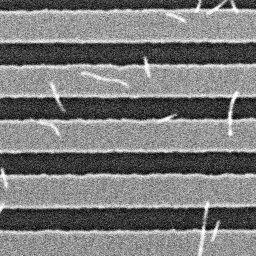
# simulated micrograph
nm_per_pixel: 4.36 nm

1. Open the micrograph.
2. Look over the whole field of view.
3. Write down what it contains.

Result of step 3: lines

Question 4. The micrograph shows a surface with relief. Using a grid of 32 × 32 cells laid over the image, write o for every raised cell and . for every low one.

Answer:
................................
oooooooooooooooooooooooooooooooo
oooooooooooooooooooooooooooooooo
oooooooooooooooooooooooooooooooo
oooooooooooooooooooooooooooooooo
................................
................................
................................
oooooooooooooooooooooooooooooooo
oooooooooooooooooooooooooooooooo
oooooooooooooooooooooooooooooooo
oooooooooooooooooooooooooooooooo
................................
................................
................................
oooooooooooooooooooooooooooooooo
oooooooooooooooooooooooooooooooo
oooooooooooooooooooooooooooooooo
oooooooooooooooooooooooooooooooo
................................
................................
................................
oooooooooooooooooooooooooooooooo
oooooooooooooooooooooooooooooooo
oooooooooooooooooooooooooooooooo
oooooooooooooooooooooooooooooooo
................................
................................
................................
oooooooooooooooooooooooooooooooo
oooooooooooooooooooooooooooooooo
oooooooooooooooooooooooooooooooo